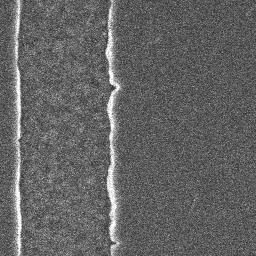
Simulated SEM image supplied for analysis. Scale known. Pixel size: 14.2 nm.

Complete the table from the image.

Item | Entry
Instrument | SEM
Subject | one or a few lines or trenches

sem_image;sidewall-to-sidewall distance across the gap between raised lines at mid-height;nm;1300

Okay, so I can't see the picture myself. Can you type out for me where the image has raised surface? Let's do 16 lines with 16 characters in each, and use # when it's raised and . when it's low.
#......#########
#......#########
#......#########
#......#########
#......#########
#......#########
#......#########
#......#########
#......#########
#......#########
#......#########
#......#########
#......#########
#......#########
#......#########
#......#########